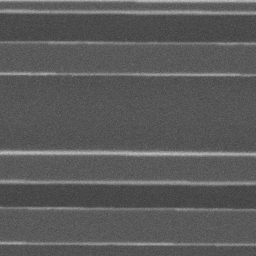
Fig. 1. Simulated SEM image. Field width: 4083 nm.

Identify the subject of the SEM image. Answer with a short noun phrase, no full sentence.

lines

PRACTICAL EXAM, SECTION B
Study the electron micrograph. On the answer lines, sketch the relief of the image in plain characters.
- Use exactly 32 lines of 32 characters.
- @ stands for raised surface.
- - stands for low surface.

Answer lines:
@@@@@@@@@@@@@@@@@@@@@@@@@@@@@@@@
---------------@@@@@@@@@@@@@@@@@
--------------------------------
--------------------------------
--------------------------------
@@@@@@@@@@@@@@@@@@@@@@@@@@@@-@@-
@@@@@@@@@@@@@@@@@@@@@@@@@@@@@@@@
@@@@@@@@@@@@@@@@@@@@@@@@@@@@@@@@
@@@@@@@@@@@@@@@@@@@@@@@@@@@@@@@@
--------------------------------
--------------------------------
--------------------------------
--------------------------------
--------------------------------
--------------------------------
--------------------------------
--------------------------------
--------------------------------
--------------------------------
@@@@@@@@@@@@@@@@@@@@@@@@@@@@@@@@
@@@@@@@@@@@@@@@@@@@@@@@@@@@@@@@@
@@@@@@@@@@@@@@@@@@@@@@@@@@@@@@@@
@@@@@@@@@@@@@@@@@@@@@@@@@@@@@@@@
--------------------------------
--------------------------------
--------------------------------
@@@@@@@@@@@@@@@@@@@@@@@@@@@@@@@@
@@@@@@@@@@@@@@@@@@@@@@@@@@@@@@@@
@@@@@@@@@@@@@@@@@@@@@@@@@@@@@@@@
@@@@@@@@@@@@@@@@@@@@@@@@@@@@@@@@
--------------------@@@@@@@@@@@@
--------------------------------